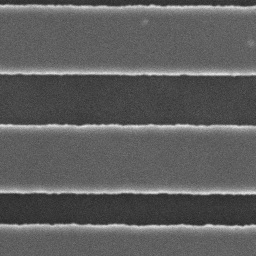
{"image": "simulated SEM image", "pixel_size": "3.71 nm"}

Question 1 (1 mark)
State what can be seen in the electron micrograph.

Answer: lines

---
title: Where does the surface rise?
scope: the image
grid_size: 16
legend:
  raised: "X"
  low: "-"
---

XXXXXXXXXXXXXXXX
XXXXXXXXXXXXXXXX
XXXXXXXXXXXXXXXX
XXXXXXXXXXXXXXXX
XXXXXXXXXXXXXXXX
----------------
----------------
----------------
XXXXXXXXXXXXXXXX
XXXXXXXXXXXXXXXX
XXXXXXXXXXXXXXXX
XXXXXXXXXXXXXXXX
----------------
----------------
XXXXXXXXXXXXXXXX
XXXXXXXXXXXXXXXX